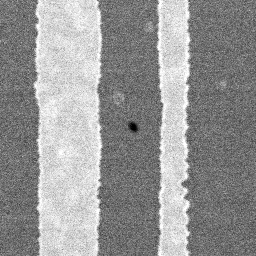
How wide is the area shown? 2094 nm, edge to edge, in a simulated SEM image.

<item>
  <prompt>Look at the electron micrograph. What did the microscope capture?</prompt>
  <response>one or a few lines or trenches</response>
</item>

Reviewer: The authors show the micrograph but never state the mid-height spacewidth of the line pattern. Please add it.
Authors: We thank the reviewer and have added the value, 0.514 µm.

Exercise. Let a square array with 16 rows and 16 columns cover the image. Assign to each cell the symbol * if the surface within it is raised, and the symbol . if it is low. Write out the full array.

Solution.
..****....**....
..****....**....
..****....**....
..****....**....
..****....**....
..****....**....
..****....**....
...***....**....
..****....**....
..****....**....
...***....**....
..****....*.....
..****....**....
..****....**....
...***....**....
...***....**....